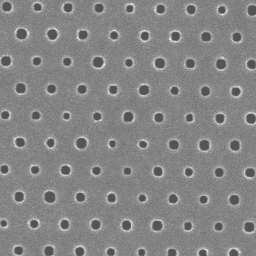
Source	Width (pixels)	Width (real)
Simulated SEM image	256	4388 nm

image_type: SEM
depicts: a regular array of holes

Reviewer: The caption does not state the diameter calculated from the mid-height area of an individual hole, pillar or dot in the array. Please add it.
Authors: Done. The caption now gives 161 nm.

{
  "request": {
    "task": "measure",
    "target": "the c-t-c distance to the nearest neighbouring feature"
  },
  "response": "0.524 um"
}